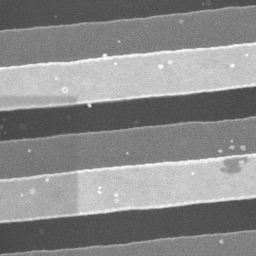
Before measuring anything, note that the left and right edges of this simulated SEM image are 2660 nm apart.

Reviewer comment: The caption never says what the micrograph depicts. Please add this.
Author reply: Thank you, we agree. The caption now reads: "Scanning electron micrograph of lines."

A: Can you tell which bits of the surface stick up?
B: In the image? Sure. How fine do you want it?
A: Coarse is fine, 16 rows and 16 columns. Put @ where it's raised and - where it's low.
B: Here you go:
--------------@@
-----@@@@@@@@@@@
@@@@@@@@@@@@@@@@
@@@@@@@@@@@@@@@@
@@@@@@@@@@@@@@@@
@@@@@@@@@@@@@@@-
@@@@@-----------
--------------@@
---@@@@@@@@@@@@@
@@@@@@@@@@@@@@@@
@@@@@@@@@@@@@@@@
@@@@@@@@@@@@@@@@
@@@@@@@@@@@@@@@-
@@@@@-----------
---------------@
-----@@@@@@@@@@@